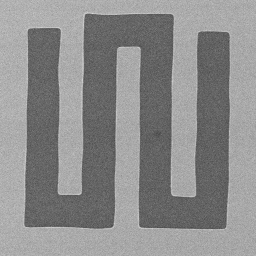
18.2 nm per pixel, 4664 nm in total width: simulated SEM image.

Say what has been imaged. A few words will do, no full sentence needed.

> groups of lines, slits or small figures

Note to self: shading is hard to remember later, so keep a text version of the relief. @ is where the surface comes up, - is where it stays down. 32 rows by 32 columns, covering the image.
@@@@@@@@@@@@@@@@@@@@@@@@@@@@@@@@
@@@@@@@@@@@@@@@@@@@@@@@@@@@@@@@@
@@@@@@@@@@------------@@@@@@@@@@
@@@@---@@@------------@@@@@@@@@@
@@@-----@@------------@@@----@@@
@@@-----@@------------@@@----@@@
@@@-----@@-----@@@----@@@----@@@
@@@----@@@-----@@-----@@@----@@@
@@@----@@@-----@@-----@@@----@@@
@@@----@@@-----@@-----@@@----@@@
@@@----@@@-----@@-----@@@----@@@
@@@-----@@-----@@-----@@@----@@@
@@@-----@@-----@@-----@@@----@@@
@@@-----@@-----@@-----@@-----@@@
@@@-----@@-----@@-----@@@----@@@
@@@----@@@-----@@-----@@@----@@@
@@@----@@@-----@@-----@@@----@@@
@@@----@@@-----@@-----@@-----@@@
@@@----@@@-----@@-----@@-----@@@
@@@----@@@-----@@----@@@-----@@@
@@@----@@@-----@@----@@@-----@@@
@@@----@@@----@@@----@@@-----@@@
@@@----@@@----@@@----@@@-----@@@
@@@----@@@----@@@----@@@-----@@@
@@@-----------@@@-----@@-----@@@
@@@-----------@@@------------@@@
@@@-----------@@@-----------@@@@
@@@-----------@@@-----------@@@@
@@@@-@@@@-----@@@@----------@@@@
@@@@@@@@@@@@@@@@@@@@@@@@@@@@@@@@
@@@@@@@@@@@@@@@@@@@@@@@@@@@@@@@@
@@@@@@@@@@@@@@@@@@@@@@@@@@@@@@@@